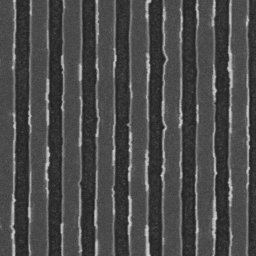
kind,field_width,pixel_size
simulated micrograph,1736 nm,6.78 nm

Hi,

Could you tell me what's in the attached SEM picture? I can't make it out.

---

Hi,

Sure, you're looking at parallel lines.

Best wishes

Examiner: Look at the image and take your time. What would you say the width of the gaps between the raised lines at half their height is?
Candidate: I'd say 100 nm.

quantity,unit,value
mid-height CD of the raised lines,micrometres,0.127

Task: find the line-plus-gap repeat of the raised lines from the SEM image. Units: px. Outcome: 33.3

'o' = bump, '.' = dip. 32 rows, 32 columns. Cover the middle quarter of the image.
oooo....ooooo....oooo....oooo...
oooo....oooo.....oooo....oooo...
oooo....oooo.....oooo....oooo...
oooo....oooo.....oooo....oooo...
oooo....oooo.....oooo....oooo...
oooo....oooo....ooooo....oooo...
oooo....ooooo....oooo....oooo...
oooo....ooooo....oooo....oooo...
oooo....oooo.....oooo....oooo...
ooooo...ooooo....oooo....oooo...
ooooo...ooooo....oooo....oooo...
oooo....ooooo....oooo....oooo...
oooo....ooooo...ooooo....ooooo..
oooo.....oooo...ooooo....ooooo..
oooo.....oooo...ooooo....ooooo..
oooo....ooooo...ooooo....oooo...
oooo....ooooo...ooooo....oooo...
oooo....oooo....ooooo....oooo...
oooo....oooo....ooooo....oooo...
oooo....ooooo...ooooo....oooo...
oooo....ooooo...ooooo....oooo...
oooo....ooooo...ooooo....oooo...
oooo....ooooo....oooo....oooo...
oooo....ooooo....oooo....oooo...
oooo....ooooo...ooooo....oooo...
oooo....ooooo...ooooo....oooo...
oooo....ooooo...ooooo....oooo...
oooo....ooooo...ooooo....oooo...
oooo....oooo....ooooo...ooooo...
oooo....oooo....ooooo....oooo...
oooo....oooo....ooooo....oooo...
oooo....ooooo...ooooo....oooo...